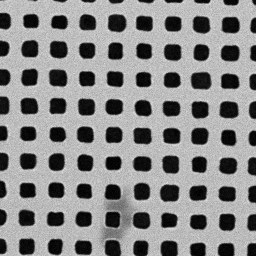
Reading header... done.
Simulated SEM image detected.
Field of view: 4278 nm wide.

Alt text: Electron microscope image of a regular array of holes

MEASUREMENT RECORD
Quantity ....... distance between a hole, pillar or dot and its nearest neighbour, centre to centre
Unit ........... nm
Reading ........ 464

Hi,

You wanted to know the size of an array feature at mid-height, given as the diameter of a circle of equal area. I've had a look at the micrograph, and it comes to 0.291 microns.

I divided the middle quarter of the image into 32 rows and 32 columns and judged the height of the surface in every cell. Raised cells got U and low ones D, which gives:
UUUUUUUUUUUUUUUUUUUUUUUUUUUUUUUU
UUUUUUUUUUUUUUUUUUUUUUUUUUUUUUUU
DUUUDDDDUUUDDDDUUUDDDDUUUUDDDUUU
DUUUDDDDUUUDDDDUUUDDDDUUUDDDDUUU
DUUUDDDDUUUDDDDUUUDDDDUUUDDDDUUU
UUUUUDDUUUUDDDDUUUDDDDUUUDDDDUUU
UUUUUUUUUUUUUUUUUUUUUUUUUUUUUUUU
UUUUUUUUUUUUUUUUUUUUUUUUUUUUUUUU
UUUUUUUUUUUUUUUUUUUUUUUUUUUUUUUU
DUUUDDDDUUUDDDDUUUDDDUUUUDDDUUUU
DUUDDDDDUUDDDDDUUUDDDDUUUDDDDUUU
UUUDDDDDUUDDDDDUUUDDDDUUUDDDDUUU
UUUUDDDUUUUDDDUUUUDDDDUUUDDDDUUU
UUUUUUUUUUUUUUUUUUUUUUUUUUUUUUUU
UUUUUUUUUUUUUUUUUUUUUUUUUUUUUUUU
UUUUUDUUUUUUUUUUUUUUUUUUUUUUUUUU
UUUDDDDUUUUDDDUUUDDDDDUUUDDDDUUU
DUUDDDDUUUDDDDDUUDDDDDUUUDDDDUUU
UUUDDDDDUUDDDDDUUDDDDDUUUDDDDUUU
UUUUDDDUUUUDDDUUUUDDDDUUUDDDDUUU
UUUUUUUUUUUUUUUUUUUUUUUUUUUUUUUU
UUUUUUUUUUUUUUUUUUUUUUUUUUUUUUUU
UUUUUUUUUUUUUUUUUUUUUUUUUUUUUUUU
UUUDDDDUUUUDDDUUUUDDDDUUUDDDUUUU
UUUDDDDDUUDDDDUUUUDDDDUUUDDDDUUU
UUUDDDDUUUDDDDUUUDDDDDUUUDDDDUUU
UUUUDDDUUUUDDUUUUUDDDDUUUDDDDUUU
UUUUUUUUUUUUUUUUUUUUUUUUUUDDUUUU
UUUUUUUUUUUUUUUUUUUUUUUUUUUUUUUU
UUUUUUUUUUUUUUUUUUUUUUUUUUUUUUUU
UUUDDDDUUUUDDDUUUUDDDUUUUDDDUUUU
UUUDDDDUUUDDDDUUUDDDDDUUDDDDDUUD